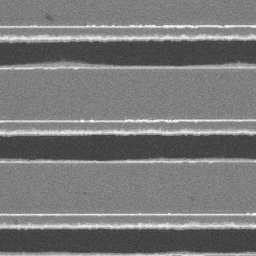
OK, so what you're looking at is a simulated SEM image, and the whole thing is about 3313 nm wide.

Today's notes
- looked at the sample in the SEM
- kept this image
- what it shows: lines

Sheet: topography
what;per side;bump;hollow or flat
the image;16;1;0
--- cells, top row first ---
1111111111111111
1111111111111111
0000000000000000
0000000000000000
1111111111111111
1111111111111111
1111111111111111
1111111111111111
0000000000000000
0000000000000000
1111111111111111
1111111111111111
1111111111111111
1111111111111111
0000000000000000
0000000000000000